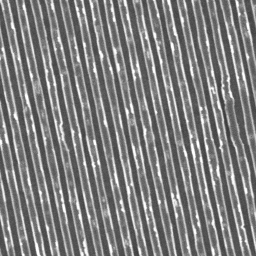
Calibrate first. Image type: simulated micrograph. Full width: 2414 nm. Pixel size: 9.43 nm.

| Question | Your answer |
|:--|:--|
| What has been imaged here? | parallel lines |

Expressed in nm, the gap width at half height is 65.9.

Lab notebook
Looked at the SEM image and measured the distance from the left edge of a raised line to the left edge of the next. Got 14.4 px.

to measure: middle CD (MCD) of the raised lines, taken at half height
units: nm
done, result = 67